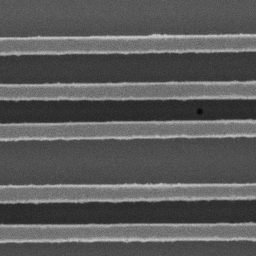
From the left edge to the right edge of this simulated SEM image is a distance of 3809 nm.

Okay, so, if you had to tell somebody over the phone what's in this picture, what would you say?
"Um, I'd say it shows lines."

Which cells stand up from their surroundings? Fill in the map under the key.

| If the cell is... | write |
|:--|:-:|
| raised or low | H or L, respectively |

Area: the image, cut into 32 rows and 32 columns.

LLLLLLLLLLLLLLLLLLLLLLLLLLLLLLLL
LLLLLLLLLLLLLLLLLLLLLLLLLLLLLLLL
LLLLLLLLLLLLLLLLLLLLLLLLLLLLLLLL
LLLLLLLLLLLLLLLLLLLLLLLLLLLLLLLL
LLLLLLLLLLLLLLLLLLHHHHHHHHHHHHHH
HHHHHHHHHHHHHHHHHHHHHHHHHHHHHHHH
HHHHHHHHHHHHHHHHHHHHHHHHHHHLLLLL
LLLLLLLLLLLLLLLLLLLLLLLLLLLLLLLL
LLLLLLLLLLLLLLLLLLLLLLLLLLLLLLLL
LLLLLLLLLLLLLLLLLLLLLLLLLLLLLLLL
LLLLLLHHHHHHHHHHHHHHHHHHHHHHHHHH
HHHHHHHHHHHHHHHHHHHHHHHHHHHHHHHH
LHHLLHLLLLLLLLLLLLLLLLLLLLLLLLLL
LLLLLLLLLLLLLLLLLLLLLLLLLLLLLLLL
LLLLLLLLLLLLLLLLLLLLLLLLLLLLLLLL
LHHHHHHHHHHHHHHHHHHHHHHHHHHHHHHH
HHHHHHHHHHHHHHHHHHHHHHHHHHHHHHHH
HHHLLLLLLLLLLLLLLLLLLLLLLLLLLLLL
LLLLLLLLLLLLLLLLLLLLLLLLLLLLLLLL
LLLLLLLLLLLLLLLLLLLLLLLLLLLLLLLL
LLLLLLLLLLLLLLLLLLLLLLLLLLLLLLLL
LLLLLLLLLLLLLLLLLLLLLLLLLLLLLLLL
LLLLLLLLLLLLLLLLLLLLLLLLLLLLLLLL
HHHHHHHHHHHHHHHHHHHHHHHHHHHHHHHH
HHHHHHHHHHHHHHHHHHHHHHHHHHHHHHHH
LLLLLLLLLLLLLLLLLLLLLLLLLLLLLLLL
LLLLLLLLLLLLLLLLLLLLLLLLLLLLLLLL
LLLLLLLLLLLLLLLLLLLLLLLLLLLLLLLL
HHHHHHHHHHHHHHHHHHHHHHHHHHHHHHHH
HHHHHHHHHHHHHHHHHHHHHHHHHHHHHHHH
LLLLLLLLLLLLLLLLLLLLLLLLLLLLLLLL
LLLLLLLLLLLLLLLLLLLLLLLLLLLLLLLL